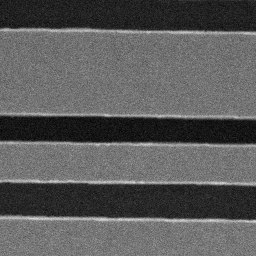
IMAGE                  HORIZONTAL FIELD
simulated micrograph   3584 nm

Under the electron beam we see lines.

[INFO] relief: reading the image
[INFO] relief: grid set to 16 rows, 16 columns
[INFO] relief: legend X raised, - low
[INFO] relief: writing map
----------------
----------------
XXXXXXXXXXXXXXXX
XXXXXXXXXXXXXXXX
XXXXXXXXXXXXXXXX
XXXXXXXXXXXXXXXX
XXXXXXXXXXXXXXXX
----------------
----------------
XXXXXXXXXXXXXXXX
XXXXXXXXXXXXXXXX
---------------X
----------------
----------------
XXXXXXXXXXXXXXXX
XXXXXXXXXXXXXXXX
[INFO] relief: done